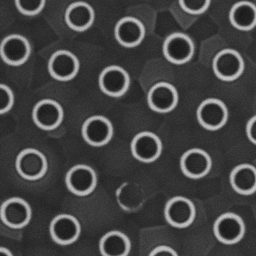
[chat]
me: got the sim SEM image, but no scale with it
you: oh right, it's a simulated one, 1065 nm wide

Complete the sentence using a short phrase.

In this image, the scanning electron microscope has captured a regular array of ring-shaped raised bodies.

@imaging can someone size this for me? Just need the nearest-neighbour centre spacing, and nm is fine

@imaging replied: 218